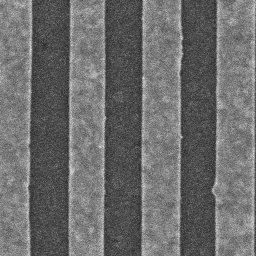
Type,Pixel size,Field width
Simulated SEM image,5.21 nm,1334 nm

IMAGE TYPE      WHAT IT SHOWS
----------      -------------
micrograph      one or a few lines or trenches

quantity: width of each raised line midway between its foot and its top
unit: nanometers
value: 197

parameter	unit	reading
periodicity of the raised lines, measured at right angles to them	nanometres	387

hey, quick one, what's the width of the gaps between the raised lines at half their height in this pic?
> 197 nm